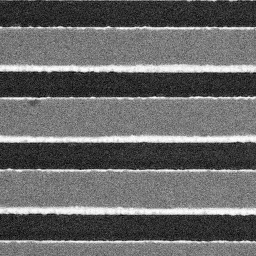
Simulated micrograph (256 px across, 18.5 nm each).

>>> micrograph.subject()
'lines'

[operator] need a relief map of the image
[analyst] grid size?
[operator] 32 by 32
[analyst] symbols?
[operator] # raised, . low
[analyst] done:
................................
................................
................................
#########....#..#.#.#....#......
################################
################################
################################
################################
################################
................................
................................
................................
################################
################################
################################
################################
################################
##################..#.#######...
................................
................................
................................
################################
################################
################################
################################
################################
...............#################
................................
................................
................................
################################
################################